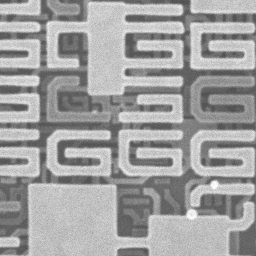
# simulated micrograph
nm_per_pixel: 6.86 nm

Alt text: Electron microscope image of wiring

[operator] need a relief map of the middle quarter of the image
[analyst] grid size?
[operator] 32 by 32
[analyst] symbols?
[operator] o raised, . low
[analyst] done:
oooo..oooooooooooooooooooooooo..
......ooooooooo.................
......ooooooooo.................
oooo..ooooooooooooooooooooooo...
oooo..oooooooooooooooooooooooo..
......ooooooooo.................
......ooooooooo.................
......oooooooo..................
..................ooooooooooo...
..................ooooooooooo...
...........................oo...
...........................oo...
oooooooooooo..oooooooooooooooo..
oooooooooooo..oooooooooooooooo..
...............oooooooooooooo...
................................
................................
oooooooooooo..oooooooooooooooo..
oooooooooooo..ooooooooooooooo...
..............oo................
..............oo................
oooooooooooo..oo..ooooooooooo...
oooooooooooo..oo..ooooooooooo...
.........ooo..oo...........oo...
.........ooo..oo............o...
o.......oooo..oooo.........oo...
oooooooooooo..ooooooooooooooo...
oooooooooooo....ooooooooooooo...
................................
................................
ooooooooooooo...................
ooooooooooooo...................